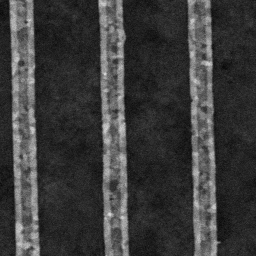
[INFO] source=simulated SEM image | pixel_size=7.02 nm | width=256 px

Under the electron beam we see one or a few lines or trenches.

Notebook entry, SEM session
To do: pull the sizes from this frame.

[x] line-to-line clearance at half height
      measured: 508 nanometers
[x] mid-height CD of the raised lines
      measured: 118 nanometers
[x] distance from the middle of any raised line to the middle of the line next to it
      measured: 626 nanometres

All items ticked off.